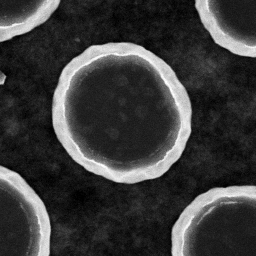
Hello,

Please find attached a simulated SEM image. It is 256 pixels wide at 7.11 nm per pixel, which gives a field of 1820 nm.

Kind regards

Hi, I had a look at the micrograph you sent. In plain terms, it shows raised bodies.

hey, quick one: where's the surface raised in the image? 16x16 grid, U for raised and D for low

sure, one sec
UUUDDDDDDDDDDUUU
UUDDDDDDDDDDDUUU
DDDDDDDDDDDDDDUU
DDDDDDUUUDDDDDDD
DDDDUUUUUUDDDDDD
DDDDUUUUUUUDDDDD
DDDDUUUUUUUDDDDD
DDDDUUUUUUUUDDDD
DDDDUUUUUUUDDDDD
DDDDDUUUUUUDDDDD
DDDDDDUUUUDDDDDD
UDDDDDDDDDDDDDDD
UUDDDDDDDDDDDUUU
UUUDDDDDDDDDUUUU
UUUDDDDDDDDUUUUU
UUUDDDDDDDDUUUUU